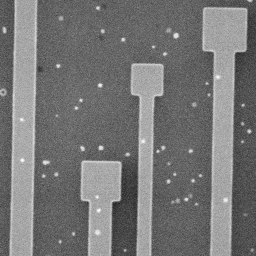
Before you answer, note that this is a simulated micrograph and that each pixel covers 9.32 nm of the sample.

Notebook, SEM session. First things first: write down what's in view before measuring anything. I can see groups of lines, slits or small figures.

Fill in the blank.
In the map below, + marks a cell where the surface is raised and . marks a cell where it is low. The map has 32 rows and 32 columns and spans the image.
..++............................
..++.....................++++++.
..++.....................++++++.
..++.....................++++++.
..++.....................++++++.
..++.....................++++++.
..++......................++++..
..++.......................++...
..++.............+++.......++...
..++.............+++.......++...
..++.............+++.......++...
..++.............+++.......++...
..++.............++........++...
..++.............++........++...
..++.............++........++...
..++.............++........++...
..++.............++........++...
..++.............++........++...
..++.............++........++...
..++.............++........++...
..++......+++++..++........++...
..++......+++++..++........++...
..++......+++++..++........++...
..++......+++++..++........++...
.+++......+++++..++........++...
.+++.......+++...++........++...
.+++.......+++...++.......+++...
.+++.......+++...++.......+++...
.+++.......+++...++.......+++...
.+++.......+++...++.......+++...
.+++.......+++...++.......+++...
.+++.......+++...++.......+++...